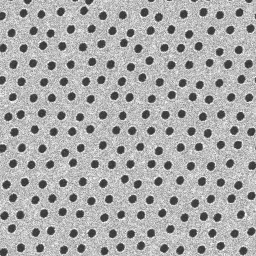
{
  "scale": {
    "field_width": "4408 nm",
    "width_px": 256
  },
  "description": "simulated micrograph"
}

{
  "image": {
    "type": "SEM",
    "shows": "a regular array of holes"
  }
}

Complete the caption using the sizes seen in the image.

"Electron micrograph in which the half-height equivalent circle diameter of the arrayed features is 0.152 um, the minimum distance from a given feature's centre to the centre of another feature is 289 nanometres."